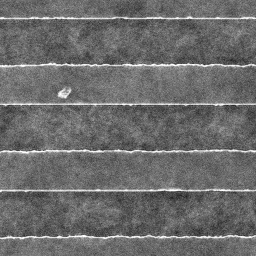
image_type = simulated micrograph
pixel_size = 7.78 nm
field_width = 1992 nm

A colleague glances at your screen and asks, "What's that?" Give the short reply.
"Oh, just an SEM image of lines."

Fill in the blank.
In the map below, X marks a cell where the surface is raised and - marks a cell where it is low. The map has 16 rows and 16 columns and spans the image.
XXXXXXXXXXXXXXXX
----------------
----------------
----------------
XXXXXXXXXXXXXXXX
XXXXXXXXXXXXXXXX
XX---X-XX-XX-XX-
----------------
----------------
XXXXXXXXXXXXXXXX
XXXXXXXXXXXXXXXX
XXXXXXXXXXXXXXXX
----------------
----------------
----------------
XXXXXXXXXXXXXXXX